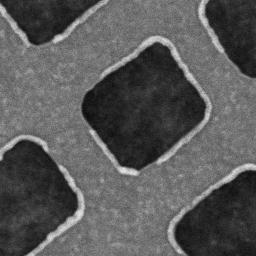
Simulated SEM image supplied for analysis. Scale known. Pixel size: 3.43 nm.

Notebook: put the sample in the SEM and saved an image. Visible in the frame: holes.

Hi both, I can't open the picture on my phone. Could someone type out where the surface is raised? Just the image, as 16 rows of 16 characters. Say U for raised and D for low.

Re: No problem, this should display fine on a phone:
DDDDDDUUUUUUUDDD
UDDDDUUUUUUUUDDD
UUDUUUUUUUUUUUDD
UUUUUUUUUDDUUUDD
UUUUUUUDDDDUUUUD
UUUUUUDDDDDDUUUU
UUUUUDDDDDDDDUUU
UUUUUDDDDDDDDUUU
UUUUUUDDDDDDUUUU
DDDUUUUDDDUUUUUU
DDDDUUUUDUUUUUUU
DDDDUUUUUUUUUUDD
DDDDDUUUUUUUUDDD
DDDDUUUUUUUDDDDD
DDDUUUUUUUUDDDDD
DDUUUUUUUUUDDDDD